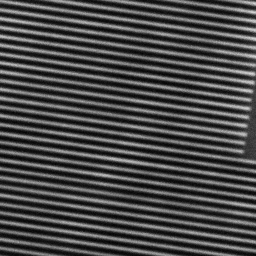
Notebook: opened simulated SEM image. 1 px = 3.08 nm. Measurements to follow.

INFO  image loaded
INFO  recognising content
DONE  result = parallel lines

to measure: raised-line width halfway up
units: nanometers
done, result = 8.4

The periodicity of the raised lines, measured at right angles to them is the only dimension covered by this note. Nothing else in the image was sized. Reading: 26.9 nanometers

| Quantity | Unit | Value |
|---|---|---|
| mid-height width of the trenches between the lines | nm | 19.4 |